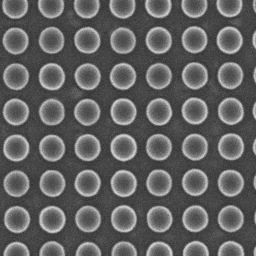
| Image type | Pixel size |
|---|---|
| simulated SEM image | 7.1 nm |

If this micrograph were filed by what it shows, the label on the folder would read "a regular array of raised bodies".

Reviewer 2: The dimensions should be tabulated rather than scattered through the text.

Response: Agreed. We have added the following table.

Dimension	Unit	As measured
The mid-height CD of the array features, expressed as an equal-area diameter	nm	178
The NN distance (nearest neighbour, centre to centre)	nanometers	251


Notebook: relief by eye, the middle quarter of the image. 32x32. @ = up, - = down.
----@@@@-----@@@------@@@------@
---@@@@@----@@@@@----@@@@@----@@
---@@@@@@---@@@@@@---@@@@@@---@@
---@@@@@@---@@@@@@---@@@@@@---@@
---@@@@@@---@@@@@----@@@@@----@@
----@@@@-----@@@@-----@@@@-----@
--------------------------------
--------------------------------
--------------------------------
----@@@@-----@@@@-----@@@@-----@
---@@@@@----@@@@@----@@@@@----@@
---@@@@@@---@@@@@@---@@@@@@---@@
---@@@@@@---@@@@@@---@@@@@@---@@
---@@@@@@---@@@@@----@@@@@----@@
----@@@@-----@@@@-----@@@@------
--------------------------------
--------------------------------
--------------------------------
----@@@@-----@@@@-----@@@@----@@
---@@@@@@---@@@@@@---@@@@@----@@
---@@@@@@---@@@@@@---@@@@@@---@@
---@@@@@@---@@@@@@---@@@@@@---@@
---@@@@@@---@@@@@@---@@@@@----@@
----@@@@-----@@@@------@@------@
--------------------------------
--------------------------------
--------------------------------
----@@@@-----@@@@-----@@@@----@@
---@@@@@@---@@@@@@---@@@@@@---@@
---@@@@@@---@@@@@@---@@@@@@---@@
---@@@@@@---@@@@@@---@@@@@@---@@
---@@@@@@---@@@@@@---@@@@@----@@